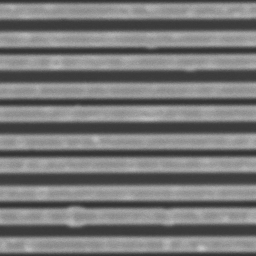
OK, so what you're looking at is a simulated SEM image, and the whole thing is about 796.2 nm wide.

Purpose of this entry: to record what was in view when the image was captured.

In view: parallel lines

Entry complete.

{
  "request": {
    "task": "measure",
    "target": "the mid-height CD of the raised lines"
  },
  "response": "48.1 nm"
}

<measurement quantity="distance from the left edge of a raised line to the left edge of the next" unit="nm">80.8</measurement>